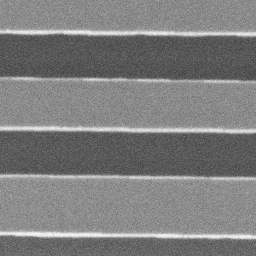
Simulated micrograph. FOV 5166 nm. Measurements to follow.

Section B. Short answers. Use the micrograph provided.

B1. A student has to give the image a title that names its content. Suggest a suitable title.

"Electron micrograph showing lines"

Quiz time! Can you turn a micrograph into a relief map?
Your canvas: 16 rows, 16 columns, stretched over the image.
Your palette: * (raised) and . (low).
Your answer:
****************
****************
................
................
................
****************
****************
****************
................
................
................
****************
****************
****************
****************
................